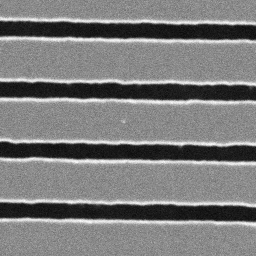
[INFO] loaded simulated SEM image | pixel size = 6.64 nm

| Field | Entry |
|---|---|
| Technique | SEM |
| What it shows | lines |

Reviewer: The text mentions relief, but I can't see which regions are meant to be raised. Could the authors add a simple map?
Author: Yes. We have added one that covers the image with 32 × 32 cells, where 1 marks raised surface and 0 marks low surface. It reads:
11111111111111111111111111111111
11111111111111111111111111111111
11111111111111111111111111111111
00000000000000000000000000000000
00000000000000000000000000000000
11111111111111111111111111111111
11111111111111111111111111111111
11111111111111111111111111111111
11111111111111111111111111111111
11111111111111111111111111111111
00000000000000010000001111111111
00000000000000000000000000000000
11111111111111111110000010000000
11111111111111111111111111111111
11111111111111111111111111111111
11111111111111111111111111111111
11111111111111111111111111111111
11111111111111111111111111111111
00000000000000000000000000000000
00000000000000000000000000000000
11111111111111111111111111111111
11111111111111111111111111111111
11111111111111111111111111111111
11111111111111111111111111111111
11111111111111111111111111111111
00000000000001101110111111111111
00000000000000000000000000000000
11111110111000000000000000000000
11111111111111111111111111111111
11111111111111111111111111111111
11111111111111111111111111111111
11111111111111111111111111111111